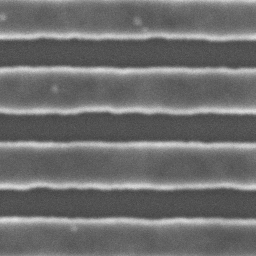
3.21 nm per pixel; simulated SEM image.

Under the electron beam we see lines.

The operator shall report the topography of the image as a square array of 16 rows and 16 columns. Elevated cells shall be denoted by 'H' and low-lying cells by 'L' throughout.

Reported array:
HHHHHHHHHHHHHHHH
HHHHHHHHHHHHHHHH
LLLLLLLLLLLLLLLL
LLLLLLLLLLLLLLLL
HHHHHHHHHHHHHHHH
HHHHHHHHHHHHHHHH
HHHHHHHHHHHHHHHH
LLLLLLLLLLLLLLLL
LLLLLLLLLLLLLLLL
HHHHHHHHHHHHHHHH
HHHHHHHHHHHHHHHH
HHHHHHHHHHHHHHHH
LLLLLLLLLLLLLLLL
LLLLLLLLLLLLLLLL
HHHHHHHHHHHHHHHH
HHHHHHHHHHHHHHHH